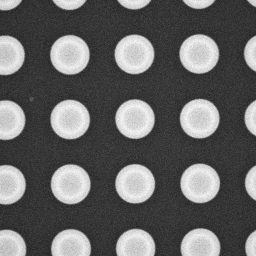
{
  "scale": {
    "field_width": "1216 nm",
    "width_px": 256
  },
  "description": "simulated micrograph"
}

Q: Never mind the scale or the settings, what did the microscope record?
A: an array of small figures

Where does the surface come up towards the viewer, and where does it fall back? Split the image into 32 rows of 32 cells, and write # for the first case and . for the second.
##.....###.....###.....###.....#
................................
................................
................................
........#.......##......##......
###....####....####....####....#
###...#####...#####...#####....#
###...#####...#####....####....#
##.....####....####....####....#
................................
................................
................................
........................##......
###....####....####....####....#
###...#####....####....####....#
###...#####....####....####....#
###....####....####....####....#
................................
................................
................................
................................
###....####....####....####....#
###...#####....####....####....#
###...#####....####....####....#
###....####....####....####....#
................................
................................
................................
................................
###....####....####....####....#
###....####....####....####....#
###....####....####....####....#